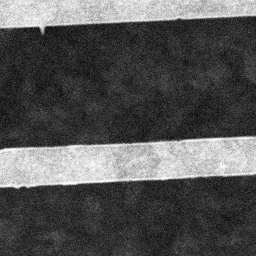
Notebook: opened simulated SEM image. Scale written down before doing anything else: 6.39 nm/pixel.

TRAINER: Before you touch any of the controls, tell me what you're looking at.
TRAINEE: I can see one or a few lines or trenches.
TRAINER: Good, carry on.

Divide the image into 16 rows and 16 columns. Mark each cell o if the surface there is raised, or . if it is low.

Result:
oooooooooooooooo
oooo............
................
................
................
................
................
................
................
oooooooooooooooo
oooooooooooooooo
ooo.............
................
................
................
................